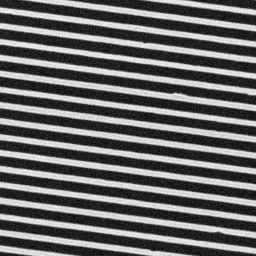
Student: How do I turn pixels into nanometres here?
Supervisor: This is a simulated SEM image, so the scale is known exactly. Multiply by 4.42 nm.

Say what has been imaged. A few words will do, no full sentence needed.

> parallel lines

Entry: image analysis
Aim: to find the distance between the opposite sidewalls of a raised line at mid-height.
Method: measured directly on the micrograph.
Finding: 23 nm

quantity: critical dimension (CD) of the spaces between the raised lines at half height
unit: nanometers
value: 46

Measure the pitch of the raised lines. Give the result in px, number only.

15.7